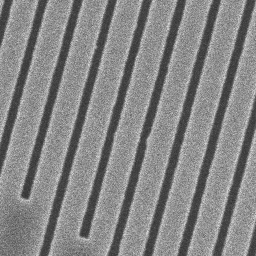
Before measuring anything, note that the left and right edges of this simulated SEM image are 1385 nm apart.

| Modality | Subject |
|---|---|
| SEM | parallel lines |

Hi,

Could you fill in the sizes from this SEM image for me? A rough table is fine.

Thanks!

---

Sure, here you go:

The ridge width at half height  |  0.136 microns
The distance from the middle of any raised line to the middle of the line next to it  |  33.5 px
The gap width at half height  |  8.1 pixels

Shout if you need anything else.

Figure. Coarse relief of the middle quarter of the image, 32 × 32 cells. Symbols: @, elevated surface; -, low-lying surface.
@@@@@@@--@@@@@@---@@@@@@--@@@@@@
@@@@@@---@@@@@@--@@@@@@@--@@@@@@
@@@@@@--@@@@@@@--@@@@@@---@@@@@@
@@@@@@--@@@@@@---@@@@@@--@@@@@@@
@@@@@---@@@@@@--@@@@@@@--@@@@@@-
@@@@@--@@@@@@@--@@@@@@@--@@@@@@-
@@@@@--@@@@@@@--@@@@@@---@@@@@@-
@@@@@--@@@@@@---@@@@@@--@@@@@@@-
@@@@---@@@@@@--@@@@@@@--@@@@@@--
@@@@--@@@@@@@--@@@@@@---@@@@@@--
@@@@--@@@@@@---@@@@@@--@@@@@@@--
@@@@--@@@@@@---@@@@@@--@@@@@@@--
@@@--@@@@@@@--@@@@@@@--@@@@@@---
@@@--@@@@@@@--@@@@@@---@@@@@@--@
@@@--@@@@@@---@@@@@@--@@@@@@@--@
@@@--@@@@@@--@@@@@@@--@@@@@@---@
@@---@@@@@@--@@@@@@---@@@@@@--@@
@@--@@@@@@@--@@@@@@--@@@@@@@--@@
@@--@@@@@@---@@@@@@--@@@@@@@--@@
@---@@@@@@--@@@@@@@--@@@@@@---@@
@--@@@@@@@--@@@@@@---@@@@@@--@@@
@--@@@@@@@--@@@@@@--@@@@@@@--@@@
@--@@@@@@---@@@@@@--@@@@@@@--@@@
--@@@@@@@--@@@@@@@--@@@@@@---@@@
--@@@@@@@--@@@@@@@--@@@@@@---@@@
--@@@@@@@--@@@@@@--@@@@@@@--@@@@
--@@@@@@---@@@@@@--@@@@@@---@@@@
-@@@@@@@--@@@@@@@--@@@@@@--@@@@@
-@@@@@@@--@@@@@@---@@@@@@--@@@@@
-@@@@@@---@@@@@@--@@@@@@@--@@@@@
-@@@@@@--@@@@@@@--@@@@@@@--@@@@@
-@@@@@@--@@@@@@---@@@@@@---@@@@@